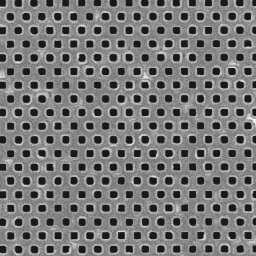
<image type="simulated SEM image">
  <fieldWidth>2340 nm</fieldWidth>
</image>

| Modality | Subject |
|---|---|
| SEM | a regular array of holes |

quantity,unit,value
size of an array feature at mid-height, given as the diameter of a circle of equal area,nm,72.2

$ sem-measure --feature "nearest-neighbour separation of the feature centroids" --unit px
15.4